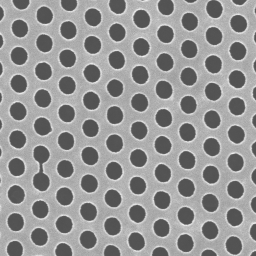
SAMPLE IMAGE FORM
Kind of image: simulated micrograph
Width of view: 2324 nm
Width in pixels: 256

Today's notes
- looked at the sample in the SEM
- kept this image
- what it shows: a regular array of holes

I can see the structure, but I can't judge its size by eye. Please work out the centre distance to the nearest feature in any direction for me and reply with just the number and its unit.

249 nm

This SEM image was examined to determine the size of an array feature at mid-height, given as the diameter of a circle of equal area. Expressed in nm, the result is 159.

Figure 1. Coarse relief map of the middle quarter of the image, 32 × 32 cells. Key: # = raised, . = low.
..####..####...###.####....#####
#####....########....###..####..
#####....########....########...
..###....########....########...
...###..###...####...###..###...
...########....########....#####
...########....########....#####
..###...###...####..###....#####
#####....########....###..####..
#####....########....########...
..###....###.####....########...
...########...####..####..####..
...########....########....#####
...########....########....#####
..###...###...####.####....#####
#####....########....###..###...
#####....########....########...
..###...#########....########...
..#########...####..###...###...
...#######.....########....#####
..#########....########....#####
.####...###...####.####....#####
####.....########...####.####...
####.....#######.....########...
..###...####.####....########...
..#########...####..###...###...
..########.....########....#####
..#########....########....#####
####....###...###..####....#####
####....#########...####..###...
####....########.....#######....
..###...###..####...########....